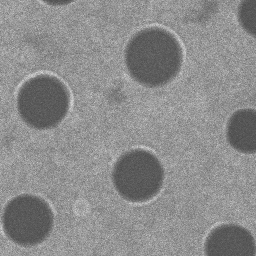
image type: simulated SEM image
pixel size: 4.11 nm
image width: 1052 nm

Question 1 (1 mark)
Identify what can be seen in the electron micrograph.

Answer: holes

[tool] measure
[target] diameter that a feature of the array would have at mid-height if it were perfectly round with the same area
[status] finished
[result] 0.211 µm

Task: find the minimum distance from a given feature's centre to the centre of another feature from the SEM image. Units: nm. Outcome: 488